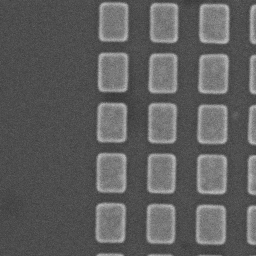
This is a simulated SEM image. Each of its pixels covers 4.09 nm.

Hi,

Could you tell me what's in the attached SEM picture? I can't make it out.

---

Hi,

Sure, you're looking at wiring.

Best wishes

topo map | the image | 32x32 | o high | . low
.............ooo...ooo..........
.............ooo...ooo...oooo..o
.............ooo...ooo...oooo..o
.............ooo...ooo...oooo..o
.............ooo...ooo...oooo..o
................................
................................
............oooo...ooo...oooo..o
............oooo...ooo...oooo..o
............oooo...ooo...ooo...o
............oooo...ooo...ooo...o
...................ooo...ooo...o
................................
............oooo...ooo...ooo...o
............oooo...ooo...ooo...o
............oooo...ooo...ooo...o
............oooo...ooo...ooo...o
............oooo...ooo...ooo...o
................................
............ooo....ooo...ooo....
............oooo...ooo...ooo...o
............oooo...ooo...ooo...o
............oooo...ooo...ooo...o
............oooo...ooo...ooo...o
................................
.............oo.................
............oooo...ooo...ooo...o
............oooo..oooo...ooo...o
............oooo..oooo...ooo...o
............oooo..oooo...ooo...o
................................
................................